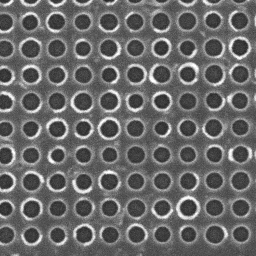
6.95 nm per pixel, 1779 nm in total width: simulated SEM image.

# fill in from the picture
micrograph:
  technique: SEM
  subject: a regular array of holes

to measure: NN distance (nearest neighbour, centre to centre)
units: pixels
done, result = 26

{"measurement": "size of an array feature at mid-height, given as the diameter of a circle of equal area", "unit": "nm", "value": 118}